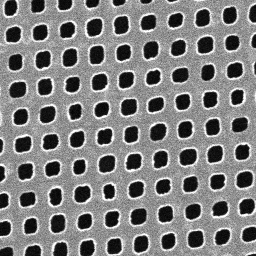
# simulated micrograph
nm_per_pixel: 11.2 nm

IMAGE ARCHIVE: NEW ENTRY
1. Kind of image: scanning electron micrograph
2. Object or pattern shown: a regular array of holes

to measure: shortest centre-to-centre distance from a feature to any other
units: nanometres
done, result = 302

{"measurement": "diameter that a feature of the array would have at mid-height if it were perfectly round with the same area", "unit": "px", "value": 16.4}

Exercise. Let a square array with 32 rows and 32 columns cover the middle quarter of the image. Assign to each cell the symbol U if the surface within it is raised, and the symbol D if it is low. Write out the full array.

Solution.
DDDUUUUUUUUUUUUUUUUUUUUUUUUUUUUU
UUUUUUUUUUUUUUUUUUUUUUUUUUUUDDDU
UUUUUUUUUDUUUUDDDUUUUDDDUUUDDDDU
UDDDUUUDDDDUUUDDDDUUUDDDUUUDDDDU
DDDDUUUDDDDUUUDDDUUUUDDDUUUDDDUU
DDDDUUUDDDDUUUDDDUUUUUUUUUUUUUUU
DDDDUUUDDUUUUUUUUUUUUUUUUUUUUUUU
UUUUUUUUUUUUUUUUUUUUUUUUUUUUUUDU
UUUUUUUUUUUUUUUUUUUUUUDDDUUUDDDD
UUUUUUUUUDUUUUUDDDUUUDDDDUUUDDDD
UUDDUUUUDDDUUUDDDDUUUDDDDUUUDDDU
UDDDUUUUDDDUUUDDDDUUUDDDUUUUUUUU
UDDDUUUUDDDUUUDDDDUUUUUUUUUUUUUU
UDDDUUUUUUUUUUUUUUUUUUUUUUUUUUUU
UUUUUUUUUUUUUUUUUUUUUUUUUUUUUDDD
UUUUUUUUUUUUUUUUUUUUUUDDDUUUUDDD
UUUUUUUUUDDDUUUDDDDUUUDDDDUUDDDD
UUDDDUUUDDDDUUUDDDDUUUDDDDUUDDDD
UDDDDUUUDDDDUUUDDDDUUDDDDUUUUDDU
UDDDDUUUDDDDUUUDDUUUUUUUUUUUUUUU
UUDDUUUUUUUUUUUUUUUUUUUUUUUUUUUU
UUUUUUUUUUUUUUUUUUUUUUUUUUUUUUDD
UUUUUUUUUUUUUUUUUDDUUUUDDDUUUDDD
UUUUUUUUUDDDDUUUDDDUUUDDDDUUUDDD
UUUDDUUUUDDDDUUUDDDUUUDDDDUUUDDD
UUDDDUUUUDDDDUUDDDDUUUUDDUUUUUUU
UUDDDUUUUDDDUUUUUUUUUUUUUUUUUUUU
UUUDDUUUUUUUUUUUUUUUUUUUUUUUUUUU
UUUUUUUUUUUUUUUUUUUUUUUUUUUUUUDD
UUUUUUUUUUUUUUUUUUDUUUUDDDDUUUDD
UUUUUDUUUUDDUUUUDDDDUUUDDDDUUUDD
UUUDDDDUUUDDDUUUDDDDUUUDDDDUUUDD